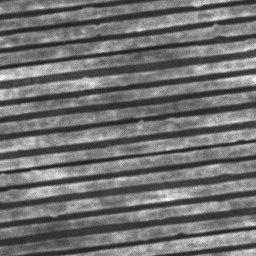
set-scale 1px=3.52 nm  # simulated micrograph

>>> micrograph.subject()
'parallel lines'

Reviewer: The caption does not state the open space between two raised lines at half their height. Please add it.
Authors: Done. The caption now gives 21 nm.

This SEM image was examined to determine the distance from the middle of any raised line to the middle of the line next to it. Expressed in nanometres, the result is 61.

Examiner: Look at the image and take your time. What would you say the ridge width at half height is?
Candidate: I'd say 38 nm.